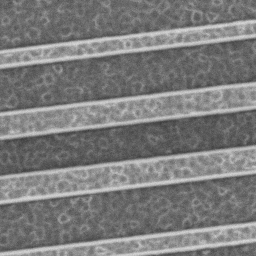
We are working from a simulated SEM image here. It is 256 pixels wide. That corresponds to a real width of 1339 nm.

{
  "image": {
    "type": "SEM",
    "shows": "one or a few lines or trenches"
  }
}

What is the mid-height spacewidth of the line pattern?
241 nm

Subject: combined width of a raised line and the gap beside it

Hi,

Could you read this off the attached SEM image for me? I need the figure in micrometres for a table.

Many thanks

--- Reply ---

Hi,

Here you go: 0.345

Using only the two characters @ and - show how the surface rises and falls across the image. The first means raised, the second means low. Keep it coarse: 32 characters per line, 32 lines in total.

--------------------------------
--------------------------------
--------------------------------
-------------------------@@@@@@@
----------------@@@@@@@@@@@@@@@@
--------@@@@@@@@@@@@@@@@--------
@@@@@@@@@@@@@@@@----------------
@@@@@@@@------------------------
--------------------------------
--------------------------------
-------------------------------@
-----------------------@@@@@@@@@
--------------@@@@@@@@@@@@@@@@@@
------@@@@@@@@@@@@@@@@@@@@@@@@@@
@@@@@@@@@@@@@@@@@@@@@@@@--------
@@@@@@@@@@@@@@@-----------------
@@@@@@@-------------------------
--------------------------------
-------------------------------@
----------------------@@@@@@@@@@
-------------@@@@@@@@@@@@@@@@@@@
-----@@@@@@@@@@@@@@@@@@@@@@@@@@@
@@@@@@@@@@@@@@@@@@@@@@@@--------
@@@@@@@@@@@@@@@@----------------
@@@@@@@-------------------------
--------------------------------
--------------------------------
--------------------------------
---------------------------@@@@@
-------------------@@@@@@@@@@@@@
----------@@@@@@@@@@@@@@@@@@@---
--@@@@@@@@@@@@@@@@@@@-----------